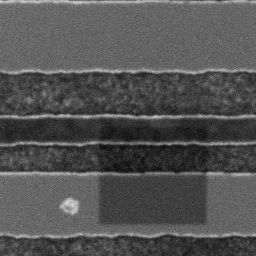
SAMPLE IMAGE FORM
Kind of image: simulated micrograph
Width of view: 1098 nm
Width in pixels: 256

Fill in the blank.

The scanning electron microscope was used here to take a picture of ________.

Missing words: lines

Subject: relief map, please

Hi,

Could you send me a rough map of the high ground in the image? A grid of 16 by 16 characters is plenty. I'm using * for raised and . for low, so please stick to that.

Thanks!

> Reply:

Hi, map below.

****************
****************
****************
****************
*****..*.****...
................
................
****************
****************
................
................
****************
****************
****************
****************
................